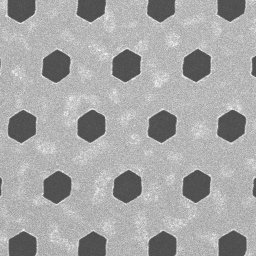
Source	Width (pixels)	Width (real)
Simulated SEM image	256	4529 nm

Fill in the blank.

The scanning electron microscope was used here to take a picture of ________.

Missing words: a regular array of holes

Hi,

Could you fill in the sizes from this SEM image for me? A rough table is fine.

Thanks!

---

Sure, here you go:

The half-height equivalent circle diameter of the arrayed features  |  534 nanometres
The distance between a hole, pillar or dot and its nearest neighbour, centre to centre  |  1220 nm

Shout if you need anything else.